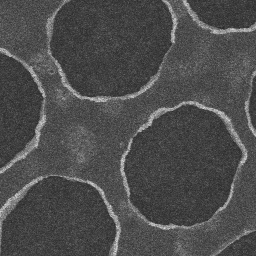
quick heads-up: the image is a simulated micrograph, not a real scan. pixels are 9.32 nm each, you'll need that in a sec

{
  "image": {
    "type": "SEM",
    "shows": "holes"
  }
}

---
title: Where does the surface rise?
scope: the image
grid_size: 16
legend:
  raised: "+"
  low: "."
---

++++.......+....
+++........++...
+++........+++++
.++.......++++++
..++......++++++
..++.....+++++++
...+++++++++++++
...+++++++....++
..+++++++......+
.+++++++.......+
++++++++.......+
++...+++.......+
+.....++......++
.......++....+++
.......+++++++++
.......+++++++..